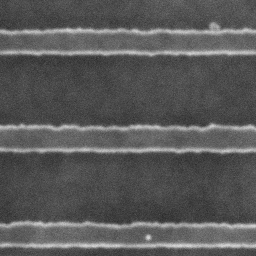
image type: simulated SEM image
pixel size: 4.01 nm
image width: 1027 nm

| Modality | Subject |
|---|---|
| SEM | lines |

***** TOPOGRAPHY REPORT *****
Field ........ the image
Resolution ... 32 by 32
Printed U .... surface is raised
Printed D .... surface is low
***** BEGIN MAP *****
DDDDDDDDDDDDDDDDDDDDDDDDDDDDDDDD
DDDDDDDDDDDDDDDDDDDDDDDDDDDDDDDD
DDDDDDDDDDDDDDDDDDDDDDDDDDDDDDDD
DDDDDDDDDDDDDDDDDDDDDDDDDDDDDDDD
UUUUUUUUUUUUUUUUUUUUUUUUUUUUUUUU
UUUUUUUUUUUUUUUUUUUUUUUUUUUUUUUU
UUUUUUUUUUUUUUUUUUUUUUUUUUUUUUUU
DDDDDDDDDDDDDDDDDDDDDDDDDDDDDDDD
DDDDDDDDDDDDDDDDDDDDDDDDDDDDDDDD
DDDDDDDDDDDDDDDDDDDDDDDDDDDDDDDD
DDDDDDDDDDDDDDDDDDDDDDDDDDDDDDDD
DDDDDDDDDDDDDDDDDDDDDDDDDDDDDDDD
DDDDDDDDDDDDDDDDDDDDDDDDDDDDDDDD
DDDDDDDDDDDDDDDDDDDDDDDDDDDDDDDD
DDDDDDDDDDDDDDDDDDDDDDDDDDDDDDDD
DDDDDDDDDDDDDDDDDDDDDDDDDDDDDDDD
UUUUUUUUUUUUUUUUUUUUUUUUUUUUUUUU
UUUUUUUUUUUUUUUUUUUUUUUUUUUUUUUU
UUUUUUUUUUUUUUUUUUUUUUUUUUUUUUUU
DDDDDDDDDDDDDDDDDDDDDDDDDDDDDDDD
DDDDDDDDDDDDDDDDDDDDDDDDDDDDDDDD
DDDDDDDDDDDDDDDDDDDDDDDDDDDDDDDD
DDDDDDDDDDDDDDDDDDDDDDDDDDDDDDDD
DDDDDDDDDDDDDDDDDDDDDDDDDDDDDDDD
DDDDDDDDDDDDDDDDDDDDDDDDDDDDDDDD
DDDDDDDDDDDDDDDDDDDDDDDDDDDDDDDD
DDDDDDDDDDDDDDDDDDDDDDDDDDDDDDDD
DDDDDDDDDDDDDDDDDDDDDDDDDDDDDDDD
UUUUUUUUUUUUUUUUUUUUUUUUUUUUUUUU
UUUUUUUUUUUUUUUUUUUUUUUUUUUUUUUU
UUUUUUUUUUUUUUUUUUUUUUUUUUUUUUUU
DDDDDDDDDDDDDDDDDDDDDDDDDDDDDDDD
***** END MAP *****